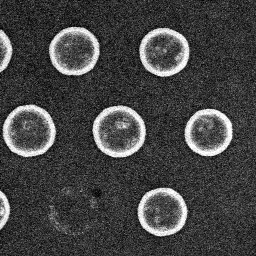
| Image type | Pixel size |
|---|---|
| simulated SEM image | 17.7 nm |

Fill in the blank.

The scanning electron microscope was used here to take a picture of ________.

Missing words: raised bodies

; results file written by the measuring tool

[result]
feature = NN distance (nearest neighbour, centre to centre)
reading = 1590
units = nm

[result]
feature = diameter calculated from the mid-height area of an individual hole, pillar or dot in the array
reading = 45.7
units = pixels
